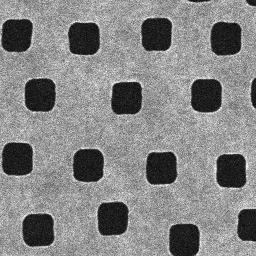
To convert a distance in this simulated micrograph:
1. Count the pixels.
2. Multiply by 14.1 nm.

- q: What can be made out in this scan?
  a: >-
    a regular array of holes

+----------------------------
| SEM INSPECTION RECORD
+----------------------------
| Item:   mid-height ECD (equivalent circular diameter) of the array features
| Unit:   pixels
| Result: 34.9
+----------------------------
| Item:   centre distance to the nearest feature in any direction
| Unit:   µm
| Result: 0.956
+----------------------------